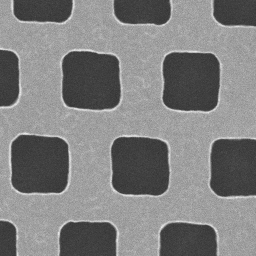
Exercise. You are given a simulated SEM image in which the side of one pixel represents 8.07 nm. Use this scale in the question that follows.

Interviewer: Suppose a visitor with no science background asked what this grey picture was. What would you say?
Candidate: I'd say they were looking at holes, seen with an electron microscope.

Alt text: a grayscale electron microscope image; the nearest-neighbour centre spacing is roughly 796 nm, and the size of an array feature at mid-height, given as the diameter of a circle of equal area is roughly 63.4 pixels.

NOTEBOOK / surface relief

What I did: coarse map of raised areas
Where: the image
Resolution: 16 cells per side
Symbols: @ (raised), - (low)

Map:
@----@@----@@---
@@@@@@@@--@@@@--
@@@@@@@@@@@@@@@@
-@@@---@@@@--@@@
-@@@---@@@----@@
-@@@----@@----@@
-@@@---@@@----@@
@@@@@@@@@@@@@@@@
@-@@@@@@@@@@@@@@
@---@@@----@@---
@---@@@----@@---
@---@@@----@@---
@@@@@@@@@@@@@@@@
@@@@@@@@@@@@@@@@
-@@@---@@@---@@@
-@@@---@@@----@@